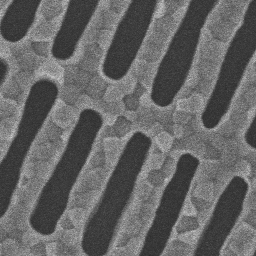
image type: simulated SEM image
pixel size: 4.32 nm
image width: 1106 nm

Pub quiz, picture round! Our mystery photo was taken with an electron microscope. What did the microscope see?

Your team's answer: holes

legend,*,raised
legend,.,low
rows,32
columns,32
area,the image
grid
*....****...****....****...****.
*....***....****...****...*****.
....****...****....****...****..
....***....****...****...*****..
...****...****....****...****...
*******..*****....***....****...
******...****....****...****....
*************....***....****...*
.************...****....****...*
.************..****....****...**
****...************....****...**
****...************...*****..***
***....************...****...***
***...********************..****
***...****...************...****
**...*****...************..****.
**...****...*******************.
**..*****...****...************.
*...****...*****...*************
*..*****...****...*****.********
...****...*****...****...*******
..*****...****...*****..********
..****...*****...****...*****.**
..***....****....****...****...*
.****....****...****...*****...*
.***....****....****...****...**
.***....***....****...*****...**
****...****....****...****....**
****...***.....****...****...***
**********....****...****...****
**********....****...****...****
***********..*****..****...*****